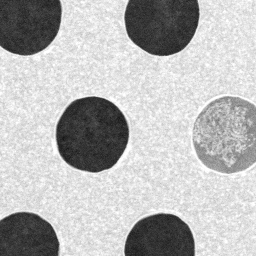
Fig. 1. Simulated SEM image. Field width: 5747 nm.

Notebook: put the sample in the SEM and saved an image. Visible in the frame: holes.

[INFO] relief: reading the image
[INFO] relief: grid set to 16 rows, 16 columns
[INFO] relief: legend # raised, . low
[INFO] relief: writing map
....####....####
....####....####
...#####....####
################
################
################
####...######...
####....####....
####....####....
####....####....
#####..######...
################
################
..#######..#####
...#####....####
....####....####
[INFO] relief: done